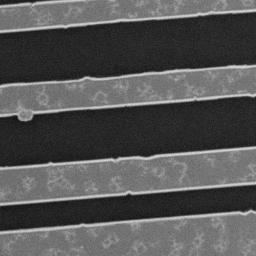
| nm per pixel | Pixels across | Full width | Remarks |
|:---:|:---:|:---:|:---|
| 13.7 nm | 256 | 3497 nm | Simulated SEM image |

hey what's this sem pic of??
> one or a few lines or trenches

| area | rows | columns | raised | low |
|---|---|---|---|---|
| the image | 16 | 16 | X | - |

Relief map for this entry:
XXXXXXXXXXXXXXXX
XXXXXX----------
----------------
----------------
-----------XXXXX
XXXXXXXXXXXXXXXX
XXXXXXXXX-------
----------------
----------------
-------------XXX
-XXXXXXXXXXXXXXX
XXXXXXXXXXXXXXX-
XXX-------------
-------------XXX
-XXXXXXXXXXXXXXX
XXXXXXXXXXXXXXXX